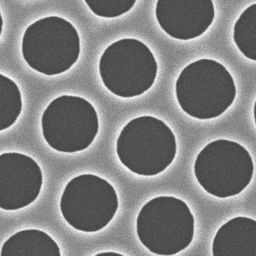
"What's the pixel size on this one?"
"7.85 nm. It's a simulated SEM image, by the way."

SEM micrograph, holes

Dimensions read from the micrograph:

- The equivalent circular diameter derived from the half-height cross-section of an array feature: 456 nm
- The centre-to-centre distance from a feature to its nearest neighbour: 629 nanometres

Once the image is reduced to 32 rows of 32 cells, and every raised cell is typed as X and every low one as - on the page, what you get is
XXXXXXXXXXX------XXX-------XXXXX
XXXXXXXXXXXX----XXX--------XXX--
XXXXX---XXXXXXXXXXXX-------XXX--
XXX------XXXXXXXXXXX------XXX---
XXX-------XXXXXXXXXXX----XXXX---
XXX-------XXXX----XXXXXXXXXXX---
XXX-------XXX------XXXXXXXXXXX--
XXX-------XXX------XXXXXX--XXXXX
XXXX-----XXX--------XXX-----XXXX
-XXXXXXXXXXXX-------XX-------XXX
--XXXXXXXXXXX------XXX-------XXX
--XXXXXXXXXXXX----XXXX-------XXX
---XXXX----XXXXXXXXXXX-------XXX
---XXX------XXXXXXXXXXX-----XXXX
--XXX-------XXXXXXXXXXXX---XXXXX
--XXX-------XXXX-----XXXXXXXXXXX
XXXXX-------XXX-------XXXXXXXXXX
XXXXXX------XXX-------XXXXX-XXXX
XXXXXXX----XXXX-------XXXX-----X
---XXXXXXXXXXXX-------XXX------X
-----XXXXXXXXXX------XXX--------
-----XXXXXXXXXXXX---XXXX--------
-----XXXX----XXXXXXXXXXXX------X
-----XXX------XXXXXXXXXXX------X
-----XXX-------XXXXXXXXXXXX--XXX
----XXXX-------XXX-----XXXXXXXXX
XXXXXXXX------XXX-------XXXXXXXX
XXXXXXXX------XXX-------XXXXX---
XXXXXXXXX----XXXX-------XXX-----
X-----XXXXXXXXXXX-------XXX-----
-------XXXXXXXXXXX------XXX-----
--------XXXXX-XXXXX---XXXXX-----